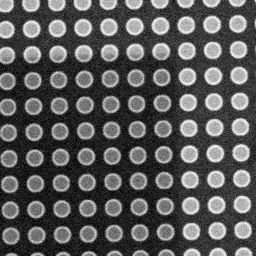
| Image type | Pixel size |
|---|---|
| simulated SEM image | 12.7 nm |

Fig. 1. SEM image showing an array of small figures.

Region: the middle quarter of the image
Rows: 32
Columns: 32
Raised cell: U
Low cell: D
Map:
DDDDDDDDDDDDDDDDDDDDDDDDDDDDDDDD
DDDDDDDDDDDDDDDDDDDDDDDDUDDDDDUU
DDDDUUUDDDUUUDDDUUUUDDDUUUDDDUUU
UDDUUUUDDDUUUDDDUUUUDDUUUUDDDUUU
UDDUUUUDDDUUUDDDUUUUDDDUUUDDDUUU
DDDDUUDDDDDUDDDDDDUDDDDDDDDDDDDD
DDDDDDDDDDDDDDDDDDDDDDDDDDDDDDDD
DDDDDDDDDDDDDDDDDDDDDDDDDDDDDDDD
DDDDUUDDDDDUUDDDDUUDDDDUUUDDDUUU
UDDUUUUDDDUUUUDDUUUUDDDUUUUDDUUU
UDDUUUUDDDUUUUDDUUUUDDDUUUUDDUUU
UDDDUUUDDDUUUDDDDUUDDDDUUUDDDDUU
DDDDDDDDDDDDDDDDDDDDDDDDDDDDDDDD
DDDDDDDDDDDDDDDDDDDDDDDDDDDDDDDD
DDDDDDDDDDDDDDDDDDUDDDDDUUDDDDUU
DDDDUUUDDDUUUUDDDUUUDDDUUUUDDUUU
UDDUUUUDDDUUUUDDUUUUDDDUUUUDDUUU
UDDDUUUDDDUUUUDDDUUUDDDUUUDDDDUU
DDDDUUDDDDDDDDDDDDDDDDDDDDDDDDDD
DDDDDDDDDDDDDDDDDDDDDDDDDDDDDDDD
DDDDDDDDDDDDDDDDDDDDDDDDDDDDDDDD
DDDDDUUDDDDUUDDDDUUUDDDUUUUDDDUU
UDDDUUUDDDUUUUDDDUUUDDDUUUUDDUUU
UDDDUUUUDDUUUUDDDUUUDDDUUUUDDDUU
UDDDUUUDDDDUUDDDDUUUDDDDUUDDDDDD
DDDDDDDDDDDDDDDDDDDDDDDDDDDDDDDD
DDDDDDDDDDDDDDDDDDDDDDDDDDDDDDDD
DDDDDDDDDDDDDDDDDDUDDDDDUUDDDDUU
UDDDUUUDDDUUUUDDDUUUDDDUUUUDDDUU
UDDDUUUUDDUUUUDDDUUUDDDUUUUDDDUU
UDDDUUUUDDDUUUDDDUUUDDDDUUUDDDUU
DDDDDDDDDDDDDDDDDDDDDDDDDDDDDDDD